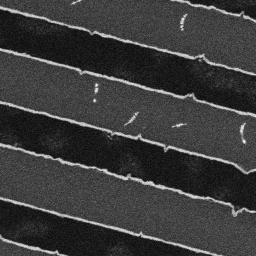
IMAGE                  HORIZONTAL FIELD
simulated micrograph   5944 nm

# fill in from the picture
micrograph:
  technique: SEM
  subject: one or a few lines or trenches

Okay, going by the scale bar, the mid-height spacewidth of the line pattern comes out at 51.8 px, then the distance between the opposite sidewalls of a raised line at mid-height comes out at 944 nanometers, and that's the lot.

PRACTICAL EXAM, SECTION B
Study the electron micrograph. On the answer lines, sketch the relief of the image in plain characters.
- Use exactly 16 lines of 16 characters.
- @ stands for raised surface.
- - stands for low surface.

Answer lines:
-------------@@@
@@@@------------
@@@@@@@@--------
--@@@@@@@@@@----
-----@@@@@@@@@@-
---------@@@@@@@
-------------@@@
@@@@------------
@@@@@@@@--------
--@@@@@@@@@@----
------@@@@@@@@@-
---------@@@@@@@
-------------@@@
@@@@------------
@@@@@@@@--------
--@@@@@@@@@@----